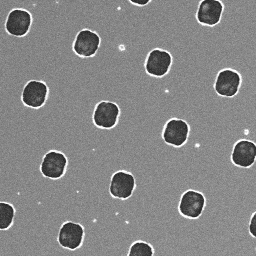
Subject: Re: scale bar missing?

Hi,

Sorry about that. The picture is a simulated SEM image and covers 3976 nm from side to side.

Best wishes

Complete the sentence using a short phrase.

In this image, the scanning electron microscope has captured a regular array of holes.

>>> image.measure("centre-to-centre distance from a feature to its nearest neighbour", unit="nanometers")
1110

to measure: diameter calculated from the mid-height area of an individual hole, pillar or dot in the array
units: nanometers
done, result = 398